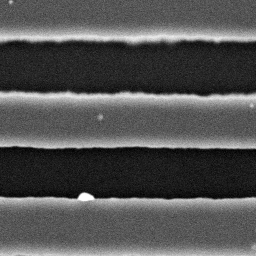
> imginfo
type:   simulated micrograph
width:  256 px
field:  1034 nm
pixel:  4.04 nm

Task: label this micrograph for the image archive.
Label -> lines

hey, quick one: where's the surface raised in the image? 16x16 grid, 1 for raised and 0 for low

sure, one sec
1111111111111111
1111111111111111
0000000000000000
0000000000000000
0000000000000000
0000000000000000
1111111111111111
1111111111111111
1111111111111111
0000000000000000
0000000000000000
0000000000000000
1111111111111111
1111111111111111
1111111111111111
1111111111111111